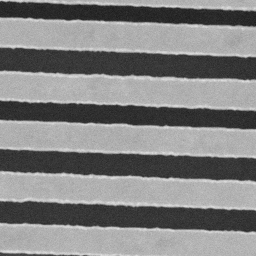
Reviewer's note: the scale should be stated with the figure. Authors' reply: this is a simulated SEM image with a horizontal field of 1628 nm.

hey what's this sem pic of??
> lines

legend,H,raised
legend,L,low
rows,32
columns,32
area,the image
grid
LLLLLLLLHHHHHHHHHHHHHHHHHHHHHHHH
LLLLLLLLLLLLLLLLLLLLLLLLLLLLLLLL
HHHHHHLLLLLLLLLLLLLLLLLLLLLLLLLL
HHHHHHHHHHHHHHHHHHHHHHHHHHHHHHHH
HHHHHHHHHHHHHHHHHHHHHHHHHHHHHHHH
HHHHHHHHHHHHHHHHHHHHHHHHHHHHHHHH
LLLLLLLLLLLLLLLLLLHHHHHHHHHHHHHH
LLLLLLLLLLLLLLLLLLLLLLLLLLLLLLLL
LLLLLLLLLLLLLLLLLLLLLLLLLLLLLLLL
HHHHHHHHHHHHHHLLHLLLLLLLLLLLLLLL
HHHHHHHHHHHHHHHHHHHHHHHHHHHHHHHH
HHHHHHHHHHHHHHHHHHHHHHHHHHHHHHHH
HHHHHHHHHHHHHHHHHHHHHHHHHHHHHHHH
LLLLLLLLLLLLLLLLLLLLLLLHHHHHHHHH
LLLLLLLLLLLLLLLLLLLLLLLLLLLLLLLL
HHHHHHHHHHHHLLLLLLLLLLLLLLLLLLLL
HHHHHHHHHHHHHHHHHHHHHHHHHHHHHHHH
HHHHHHHHHHHHHHHHHHHHHHHHHHHHHHHH
HHHHHHHHHHHHHHHHHHHHHHHHHHHHHHHH
LLLLLLLLLLLLLLLLLLLLLLLLHHHHHHHH
LLLLLLLLLLLLLLLLLLLLLLLLLLLLLLLL
LLLLLLLLLLLLLLLLLLLLLLLLLLLLLLLL
HHHHHHHHHHHHHHHHHHHHHHHHHHHLLLLL
HHHHHHHHHHHHHHHHHHHHHHHHHHHHHHHH
HHHHHHHHHHHHHHHHHHHHHHHHHHHHHHHH
LLLLLLLLLLLLLHHHHHHHHHHHHHHHHHHH
LLLLLLLLLLLLLLLLLLLLLLLLLLLLLLLL
LLLLLLLLLLLLLLLLLLLLLLLLLLLLLLLL
HHHHHHHHHHHHHHHLLLLLLLLLLLLLLLLL
HHHHHHHHHHHHHHHHHHHHHHHHHHHHHHHH
HHHHHHHHHHHHHHHHHHHHHHHHHHHHHHHH
HHHHHHHHHHHHHHHHHHHHHHHHHHHHHHHH